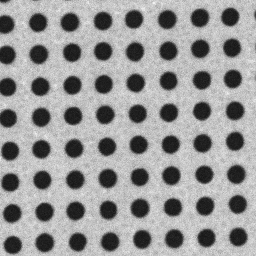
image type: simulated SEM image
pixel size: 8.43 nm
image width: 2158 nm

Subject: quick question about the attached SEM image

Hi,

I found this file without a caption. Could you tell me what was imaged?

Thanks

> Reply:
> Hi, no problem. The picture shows a regular array of holes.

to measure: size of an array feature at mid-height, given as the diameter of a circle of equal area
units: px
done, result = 18.4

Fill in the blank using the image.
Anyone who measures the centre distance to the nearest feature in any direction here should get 0.262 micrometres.